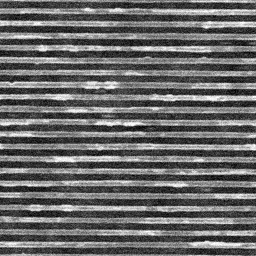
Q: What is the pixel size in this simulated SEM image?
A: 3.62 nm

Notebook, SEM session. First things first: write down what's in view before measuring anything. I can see parallel lines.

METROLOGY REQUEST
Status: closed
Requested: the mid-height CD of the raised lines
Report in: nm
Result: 16.7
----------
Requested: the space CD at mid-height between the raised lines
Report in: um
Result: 0.0262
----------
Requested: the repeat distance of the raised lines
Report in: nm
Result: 44.4